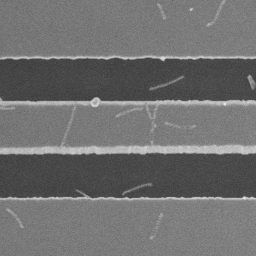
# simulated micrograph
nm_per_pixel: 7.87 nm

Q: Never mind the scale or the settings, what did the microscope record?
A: lines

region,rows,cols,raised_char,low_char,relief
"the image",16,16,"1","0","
1111111111111111
1111111111111111
1111111111111111
1111111111111111
0000000000000000
0000000000000000
1111111111111111
1111111111111111
1111111111111111
1110101000000000
0000000000000000
0000000000000000
1111111111111111
1111111111111111
1111111111111111
1111111111111111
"